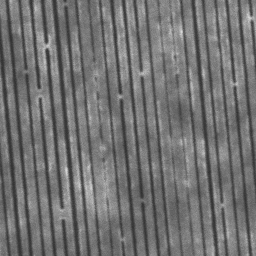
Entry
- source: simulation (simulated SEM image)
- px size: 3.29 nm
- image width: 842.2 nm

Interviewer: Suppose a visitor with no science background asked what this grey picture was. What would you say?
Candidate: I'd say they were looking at parallel lines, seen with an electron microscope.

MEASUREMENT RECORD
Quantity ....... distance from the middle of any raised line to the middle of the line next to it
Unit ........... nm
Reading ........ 37.8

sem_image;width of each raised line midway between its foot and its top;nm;27.5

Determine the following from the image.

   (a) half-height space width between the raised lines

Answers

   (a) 12.3 nm